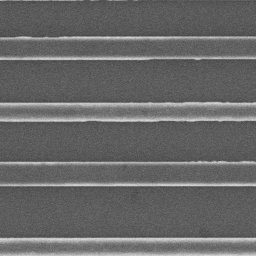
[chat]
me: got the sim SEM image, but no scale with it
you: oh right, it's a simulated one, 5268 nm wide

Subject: lines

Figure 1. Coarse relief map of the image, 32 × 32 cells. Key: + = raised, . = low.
................................
................................
................................
................................
................................
++++++++++++++++++++++++++++++++
++++++++++++++++++++++++++++++++
................................
................................
................................
................................
................................
................................
++++++++++++++++++++++++++++++++
++++++++++++++++++++++++++++++++
................................
................................
................................
................................
................................
++++++++++++++++++++++++++++++++
++++++++++++++++++++++++++++++++
++++++++++++++++++++++++++++++++
................................
................................
................................
................................
................................
................................
................................
++++++++++++++++++++++++++++++++
++++++++++++++++++++++++++++++++